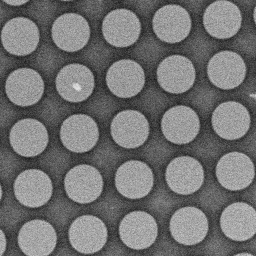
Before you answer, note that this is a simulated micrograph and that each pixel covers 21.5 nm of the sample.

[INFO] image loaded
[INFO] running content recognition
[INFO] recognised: an array of small figures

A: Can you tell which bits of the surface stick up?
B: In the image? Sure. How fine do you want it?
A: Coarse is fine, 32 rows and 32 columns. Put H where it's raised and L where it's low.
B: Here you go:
LHHLLLLLLLLLLLLLLLLLLLLLLLLHHLLL
LLLLLLLLLLLLLLHHLLLLHHHLLLHHHHLL
LHHHLLLHHHHLLHHHHLLHHHHHLHHHHHLL
HHHHHLLHHHHLLHHHHLLHHHHHLLHHHHLL
HHHHHLLHHHHLLHHHHLLLHHHLLLLHHLLL
HHHHHLLHHHHLLLHHLLLLLLLLLLLLLLLL
LHHHLLLLLLLLLLLLLLLLLLLLLLLLHLLL
LLLLLLLLLLLLLLLLLLLLHHHLLLHHHHLL
LLLLLLLLHHHLLLHHHHLLHHHHLLHHHHHL
LHHHHLLHHHHHLHHHHHLLHHHHLLHHHHHL
LHHHHLLHHHHHLHHHHHLLHHHHLLLHHHLL
LHHHHLLHHHHLLLHHHLLLLHHLLLLLLLLL
LHHHHLLLHHLLLLLLLLLLLLLLLLLLLLLL
LLLLLLLLLLLLLLLLLLLLLLHHLLLHHHHL
LLLLLLLLLHHLLLLHHHLLHHHHHLLHHHHL
LLHHHLLLHHHHLLHHHHLLHHHHHLLHHHHL
LHHHHHLLHHHHLLHHHHHLHHHHHLLHHHHL
LHHHHHLLHHHHLLHHHHLLLHHHLLLLLLLL
LLHHHHLLHHHLLLLLLLLLLLLLLLLLLLLL
LLLHLLLLLLLLLLLLLLLLLLLLLLLLHHHL
LLLLLLLLLLLLLLLLHHLLLHHHHLLHHHHH
LLLHHLLLLHHHLLLHHHHLLHHHHLLHHHHH
LLHHHHLLHHHHHLHHHHHLLHHHHLLHHHHL
LLHHHHLLHHHHHLLHHHHLLHHHHLLLHHLL
LLHHHHLLLHHHLLLLHHLLLLLLLLLLLLLL
LLLHHLLLLLLLLLLLLLLLLLLLLLLLLHHL
LLLLLLLLLLLLLLLLLHLLLLHHHLLLHHHH
LLLLLLLLLLHHLLLHHHHLLHHHHHLLHHHH
LLLHHHHLLHHHHLLHHHHHLHHHHHLLHHHH
LLHHHHHLLHHHHLLHHHHHLLHHHHLLHHHL
HLHHHHHLLHHHHLLLHHHLLLLHLLLLLLLL
LLLHHHLLLLHHLLLLLLLLLLLLLLLLLLLL